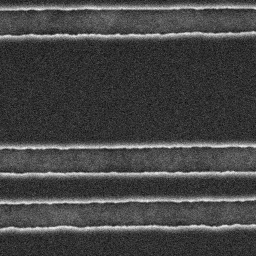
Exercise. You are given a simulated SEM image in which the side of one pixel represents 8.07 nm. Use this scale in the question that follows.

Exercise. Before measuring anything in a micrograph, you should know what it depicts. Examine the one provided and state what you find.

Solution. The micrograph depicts lines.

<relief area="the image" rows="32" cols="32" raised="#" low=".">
################################
................................
................................
................................
################################
################################
################################
################################
################################
################################
################################
################################
################################
################################
################################
################################
################################
################################
######.##.......................
................................
................................
............................##..
################################
################################
################################
................................
................................
................................
.#...###########################
################################
################################
################################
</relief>